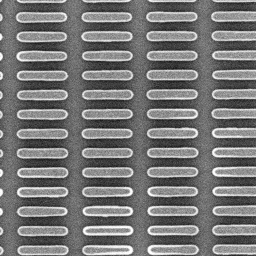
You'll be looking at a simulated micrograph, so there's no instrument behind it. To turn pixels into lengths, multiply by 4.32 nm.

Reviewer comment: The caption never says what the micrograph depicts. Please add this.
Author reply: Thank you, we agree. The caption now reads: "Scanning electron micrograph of groups of lines, slits or small figures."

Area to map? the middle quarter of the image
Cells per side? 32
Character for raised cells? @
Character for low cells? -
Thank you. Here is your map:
--------------------------------
--------------------------------
-----@@@@@@@@@@@@----@@@@@@@@@@@
-----@@@@@@@@@@@@----@@@@@@@@@@@
--------------------------------
--------------------------------
------------------------------@@
@----@@@@@@@@@@@@----@@@@@@@@@@@
-----@@@@@@@@@@@@----@@@@@@@@@@@
--------------------------------
--------------------------------
----------------------@@@@@-----
@----@@@@@@@@@@@@----@@@@@@@@@@@
-----@@@@@@@@@@@-----@@@@@@@@@@@
--------------------------------
--------------------------------
-----@@@@@@@@@@@-----@@@@@@@@@@@
@----@@@@@@@@@@@@----@@@@@@@@@@@
--------------------------------
--------------------------------
--------------------------------
-----@@@@@@@@@@@@----@@@@@@@@@@@
@----@@@@@@@@@@@@----@@@@@@@@@@@
--------------------------------
--------------------------------
--------------------------------
@----@@@@@@@@@@@@----@@@@@@@@@@@
@----@@@@@@@@@@@@----@@@@@@@@@@@
--------------------------------
--------------------------------
--------------------------------
@----@@@@@@@@@@@@----@@@@@@@@@@@